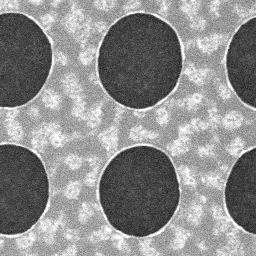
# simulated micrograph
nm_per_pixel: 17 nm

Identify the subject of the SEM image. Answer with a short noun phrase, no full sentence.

holes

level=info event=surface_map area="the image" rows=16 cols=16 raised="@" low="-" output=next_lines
@@@@@@@@@@@@@@@@
--@@@@@---@@@@@-
---@@@-----@@@--
---@@@-----@@@--
---@@@-----@@@--
---@@@@----@@@@-
--@@@@@@--@@@@@-
@@@@@@@@@@@@@@@@
@@@@@@@@@@@@@@@@
--@@@@@@--@@@@@-
---@@@@----@@@@-
---@@@-----@@@--
---@@@-----@@@--
---@@@@----@@@--
--@@@@@@--@@@@@-
@@@@@@@@@@@@@@@@